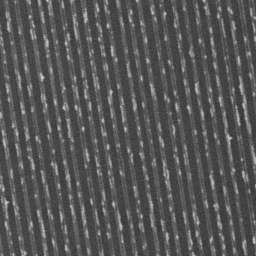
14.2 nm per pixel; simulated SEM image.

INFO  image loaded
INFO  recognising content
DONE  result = parallel lines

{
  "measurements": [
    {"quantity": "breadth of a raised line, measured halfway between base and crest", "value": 45.6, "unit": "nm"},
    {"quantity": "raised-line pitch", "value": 156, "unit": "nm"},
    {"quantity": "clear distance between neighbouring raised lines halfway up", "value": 110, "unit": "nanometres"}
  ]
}